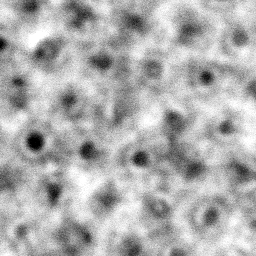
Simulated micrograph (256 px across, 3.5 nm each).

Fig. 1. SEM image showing a regular array of ring-shaped raised bodies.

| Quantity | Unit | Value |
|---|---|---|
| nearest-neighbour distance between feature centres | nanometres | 182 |